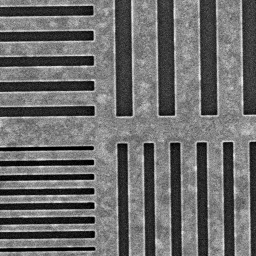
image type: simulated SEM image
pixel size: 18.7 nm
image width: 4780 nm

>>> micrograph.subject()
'groups of lines, slits or small figures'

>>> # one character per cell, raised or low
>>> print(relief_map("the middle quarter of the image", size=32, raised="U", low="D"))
DDDDDDDUUUUUUDDDDUUUUUUDDDDDUUUU
UUUUUUUUUUUUUDDDDUUUUUUDDDDDUUUU
UUUUUUUUUUUUUDDDDUUUUUUDDDDDUUUU
UUUUUUUUUUUUUDDDDUUUUUUDDDDDUUUU
DDDDDDDUUUUUUDDDDUUUUUUDDDDDUUUU
DDDDDDDDUUUUUDDDDUUUUUUDDDDDUUUU
DDDDDDDUUUUUUDDDDUUUUUUDDDDDUUUU
UUUUUUUUUUUUUDDDDUUUUUUDDDDDUUUU
UUUUUUUUUUUUUDDDDUUUUUUDDDDDUUUU
UUUUUUUUUUUUUDDDDUUUUUUDDDDDUUUU
DDDDDDDUUUUUUDDDDUUUUUUDDDDDUUUU
DDDDDDDDUUUUUDDDDUUUUUUDDDDDUUUU
DDDDDDDDUUUUUDDDDUUUUUUDDDDDUUUU
UUUUUUUUUUUUUUUUUUUUUUUUUUUUUUUU
UUUUUUUUUUUUUUUUUUUUUUUUUUUUUUUU
UUUUUUUUUUUUUUUUUUUUUUUUUUUUUUUU
UUUUUUUUUUUUUUUUUUUUUUUUUUUUUUUU
UUUUUUUUUUUUUUUUUUUUUUUUUUUUUUUU
UUUUUUUUUUUUUUUUUUUUUUUUUUUUUUUU
UUUUUUUUUUUUUUUUUUUUUUUUUUUDDUUU
UUUUDDDUUUUUUDDDUUUUDDDUUUDDDUUU
DDDDDDDUUUUUUDDDUUUUDDDUUUDDDUUU
UUUUUUUUUUUUUDDDUUUUDDDUUUDDDUUU
UUUUUUUUUUUUUDDDUUUUDDDUUUDDDUUU
DDDDDDDDUUUUUDDDUUUUDDDUUUDDDUUU
DDDDDDDUUUUUUDDDUUUUDDDUUUDDDUUU
UUUUUUUUUUUUUDDDUUUUDDDUUUDDDUUU
DDDDDDDUUUUUUDDDUUUUDDDUUUDDDUUU
DDDDDDDDUUUUUDDDUUUUDDDUUUDDDUUU
UUUUUUUUUUUUUDDDUUUUDDDUUUDDDUUU
UUUUUUUUUUUUUDDDUUUUDDDUUUDDDUUU
DDDDDDDDUUUUUDDDUUUUDDDUUUDDDUUU